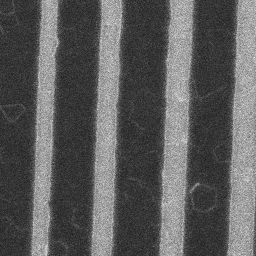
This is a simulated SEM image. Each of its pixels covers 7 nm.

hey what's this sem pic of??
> one or a few lines or trenches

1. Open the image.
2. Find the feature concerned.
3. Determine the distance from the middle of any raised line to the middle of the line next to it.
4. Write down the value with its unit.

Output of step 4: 475 nm